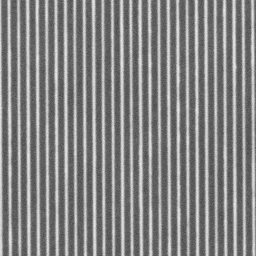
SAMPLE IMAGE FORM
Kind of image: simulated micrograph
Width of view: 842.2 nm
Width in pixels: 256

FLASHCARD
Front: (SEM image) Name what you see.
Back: parallel lines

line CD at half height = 5.3 nanometres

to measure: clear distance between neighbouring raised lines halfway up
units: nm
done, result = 23.8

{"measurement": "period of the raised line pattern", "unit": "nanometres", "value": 30.8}